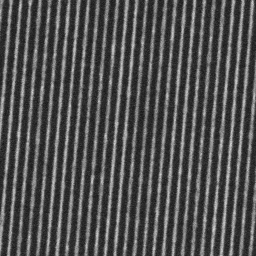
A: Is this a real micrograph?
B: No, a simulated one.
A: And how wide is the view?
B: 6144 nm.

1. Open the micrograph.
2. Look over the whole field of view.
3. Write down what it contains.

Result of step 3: parallel lines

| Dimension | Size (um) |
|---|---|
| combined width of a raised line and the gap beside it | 0.231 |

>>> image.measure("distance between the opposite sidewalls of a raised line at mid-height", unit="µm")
0.0418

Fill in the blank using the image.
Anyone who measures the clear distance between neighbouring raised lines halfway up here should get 185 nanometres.